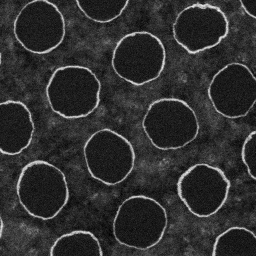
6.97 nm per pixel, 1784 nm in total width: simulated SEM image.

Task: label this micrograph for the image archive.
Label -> a regular array of raised bodies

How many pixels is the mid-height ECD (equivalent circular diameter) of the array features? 52.1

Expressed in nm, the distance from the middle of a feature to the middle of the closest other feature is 492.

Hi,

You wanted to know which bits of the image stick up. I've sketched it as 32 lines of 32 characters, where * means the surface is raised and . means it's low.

....**....******..............**
...****...*****........*****...*
..******....**........******....
..******..............******....
..******........***...******....
...****........*****..*****.....
....**........*******...........
..............*******...........
........**....******........***.
.......*****...*****.......*****
......******.....*........******
......******..............******
......******........**....******
***....*****.......*****...****.
****....**........******....**..
****..............*******.......
****........**....*******.......
****.......*****...*****.......*
***........*****....**........**
...........******.............**
....**.....******..............*
...*****...*****.......*****...*
..******.....**.......******....
..******..............******....
..******...............*****....
...*****.......*****...*****....
....***........******...***.....
..............*******...........
..............*******...........
........****..******........****
.......*****...****........*****
......*******..............*****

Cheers